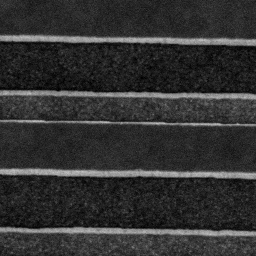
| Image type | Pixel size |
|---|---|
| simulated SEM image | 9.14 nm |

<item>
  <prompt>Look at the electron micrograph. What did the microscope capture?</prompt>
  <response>lines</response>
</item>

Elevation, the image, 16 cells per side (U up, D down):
UUUUUUUUUUUUUUUU
UUUUUUUUUUUUUUUU
DDDDDDDDUUUUUUUU
DDDDDDDDDDDDDDDD
DDDDDDDDDDDDDDDD
DDDDDDDDDDDDDDDD
UUUUUUUUUUUUUUUU
UUUUUUUUUUUUUUUU
UUUUUUUUUUUUUUUU
UUUUUUUUUUUUUUUU
UUUUUUUUUUUUUUUU
DDDDDDDDDDDDDDDD
DDDDDDDDDDDDDDDD
DDDDDDDDDDDDDDDD
UUUUUUUUDDDDDDDD
UUUUUUUUUUUUUUUU